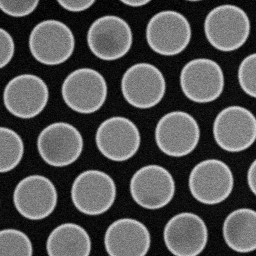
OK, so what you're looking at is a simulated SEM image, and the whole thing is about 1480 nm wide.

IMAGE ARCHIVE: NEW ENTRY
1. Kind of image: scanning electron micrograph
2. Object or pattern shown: an array of small figures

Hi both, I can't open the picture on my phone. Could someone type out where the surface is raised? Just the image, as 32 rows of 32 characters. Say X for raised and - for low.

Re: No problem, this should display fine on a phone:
XXXXX---XXX-----XX--------------
-XXX----------------XX----XXXX--
------------XXX----XXXX---XXXXX-
----XXXX---XXXXX--XXXXXX--XXXXX-
X---XXXXX--XXXXX--XXXXXX--XXXXX-
XX--XXXXX--XXXXX---XXXX---XXXX--
XX--XXXXX---XXXX----XX----------
X----XXX----------------XX-----X
----------------XXX----XXXX---XX
--XX-----XXXX---XXXX---XXXXX--XX
-XXXXX--XXXXX--XXXXXX--XXXXX--XX
-XXXXX--XXXXX--XXXXXX--XXXXX---X
-XXXXX--XXXXX---XXXX----XXX-----
-XXXX----XXX----------------XX--
--XX-----------------XXX---XXXXX
-------X-----XXXX---XXXXX--XXXXX
XX---XXXXX--XXXXX--XXXXXX--XXXXX
XXX--XXXXX--XXXXX---XXXXX--XXXXX
XXX--XXXXX--XXXXX---XXXX----XXX-
XXX--XXXXX---XXX----------------
XX----XXX----------------XXX----
-----------XX----XXXX---XXXXX--X
---XXX---XXXXX--XXXXXX--XXXXX--X
--XXXXX--XXXXX--XXXXXX--XXXXX--X
--XXXXX--XXXXX---XXXXX--XXXX----
--XXXXX--XXXXX---XXXX-----------
--XXXX----XXX----------------XXX
---------------XX----XXXX---XXXX
-------XXX----XXXX---XXXXX--XXXX
XXX---XXXXX--XXXXXX--XXXXX--XXXX
XXXX--XXXXX--XXXXXX--XXXXX---XXX
XXXX--XXXXX--XXXXX---XXXX-------